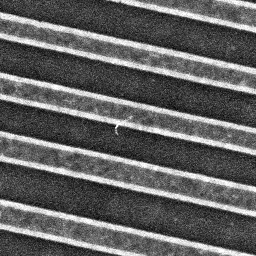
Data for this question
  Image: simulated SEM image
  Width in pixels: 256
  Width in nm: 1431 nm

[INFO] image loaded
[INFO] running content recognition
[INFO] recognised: one or a few lines or trenches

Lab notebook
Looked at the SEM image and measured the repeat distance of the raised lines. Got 336 nm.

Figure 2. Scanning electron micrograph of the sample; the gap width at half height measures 215 nanometres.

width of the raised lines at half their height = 119 nm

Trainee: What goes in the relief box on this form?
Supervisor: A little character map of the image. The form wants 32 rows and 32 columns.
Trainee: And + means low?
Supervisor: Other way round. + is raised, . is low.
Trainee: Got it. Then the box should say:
.................+++++++++++++..
......................++++++++++
+++.......................++++++
+++++++........................+
++++++++++++....................
.....+++++++++++................
.........++++++++++++...........
..............++++++++++++......
..................++++++++++++..
.......................+++++++++
+++++......................+++++
++++++++++......................
..++++++++++++..................
.......++++++++++++.............
...........++++++++++++.........
...............+++++++++++++....
....................++++++++++++
++++.....................+++++++
++++++++.....................+++
+++++++++++++...................
...+++++++++++++++..............
........++++++++++++++..........
............++++++++++++++......
.................++++++++++++++.
.....................+++++++++++
+.........................++++++
++++++.........................+
++++++++++......................
.++++++++++++++.................
.....++++++++++++++.............
..........++++++++++++++........
...............+++++++++++++....